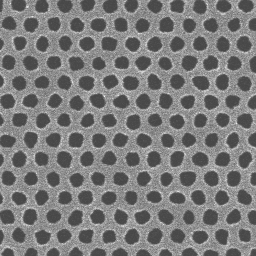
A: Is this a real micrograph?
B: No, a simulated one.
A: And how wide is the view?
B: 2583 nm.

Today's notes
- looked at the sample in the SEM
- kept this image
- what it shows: a regular array of holes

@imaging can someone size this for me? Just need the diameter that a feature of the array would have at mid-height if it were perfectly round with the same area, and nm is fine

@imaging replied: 151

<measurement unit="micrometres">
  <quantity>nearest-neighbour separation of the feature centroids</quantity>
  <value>0.216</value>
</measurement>